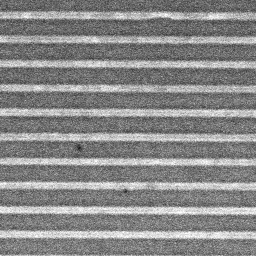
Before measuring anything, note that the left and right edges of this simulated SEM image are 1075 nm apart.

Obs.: parallel lines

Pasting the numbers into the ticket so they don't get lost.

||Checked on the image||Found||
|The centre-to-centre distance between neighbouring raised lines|24.4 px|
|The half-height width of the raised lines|21.5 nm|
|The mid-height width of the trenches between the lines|82.5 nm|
